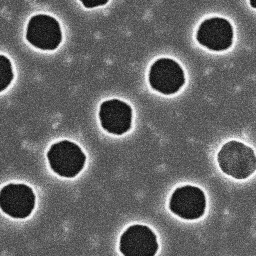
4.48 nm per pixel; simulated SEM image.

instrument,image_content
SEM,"holes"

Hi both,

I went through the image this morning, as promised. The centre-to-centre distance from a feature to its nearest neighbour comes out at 0.291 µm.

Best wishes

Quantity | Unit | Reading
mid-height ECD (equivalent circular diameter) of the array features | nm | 168